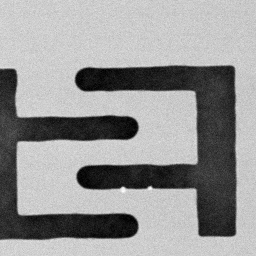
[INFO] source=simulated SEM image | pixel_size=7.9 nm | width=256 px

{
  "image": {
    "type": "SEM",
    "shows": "groups of lines, slits or small figures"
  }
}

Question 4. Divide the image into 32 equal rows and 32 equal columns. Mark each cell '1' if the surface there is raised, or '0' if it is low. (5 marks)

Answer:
11111111111111111111111111111111
11111111111111111111111111111111
11111111111111111111111111111111
11111111111111111111111111111111
11111111111111111111111111111111
11111111111111111111111111111111
11111111111111111111111111111111
11111111111111111111111111111111
11111111111000000000000000000111
00111111100000000000000000000111
00111111100000000000000000000111
00111111111111111111111100000111
00111111111111111111111100000111
00111111111111111111111110000111
00111111111100001111111110000111
00000000000000000111111100000011
00000000000000000111111110000011
00000000000000001111111110000011
00111111111111111111111110000111
00111111111111111111111110000011
00111111111111111001110000000011
00111111110000000000000000000011
00111111110000000000000000000011
00111111111000000010000000000011
00111111111111111111111100000011
00111111111111111111111110000011
00111111111111111111111110000011
00000000000000000111111110000011
00000000000000000111111110000011
00000000000000000111111110000111
11111111111111111111111111111111
11111111111111111111111111111111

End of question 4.